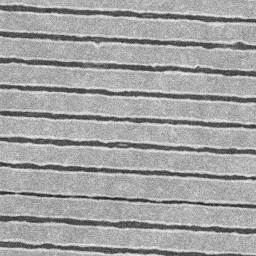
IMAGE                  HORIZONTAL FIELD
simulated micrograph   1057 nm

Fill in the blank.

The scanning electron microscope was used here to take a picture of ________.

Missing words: parallel lines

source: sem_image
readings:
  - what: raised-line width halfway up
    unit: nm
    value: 81.4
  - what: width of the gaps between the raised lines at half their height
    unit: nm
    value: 27.3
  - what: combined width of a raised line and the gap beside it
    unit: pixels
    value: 26.2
